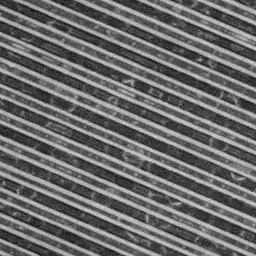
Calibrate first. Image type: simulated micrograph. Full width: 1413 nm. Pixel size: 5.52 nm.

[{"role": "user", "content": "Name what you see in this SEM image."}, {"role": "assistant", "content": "parallel lines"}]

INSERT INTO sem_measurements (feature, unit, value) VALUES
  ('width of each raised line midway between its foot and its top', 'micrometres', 0.0577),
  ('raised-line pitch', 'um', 0.132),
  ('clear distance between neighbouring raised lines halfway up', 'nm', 73.5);